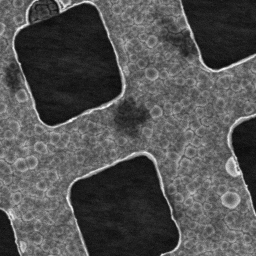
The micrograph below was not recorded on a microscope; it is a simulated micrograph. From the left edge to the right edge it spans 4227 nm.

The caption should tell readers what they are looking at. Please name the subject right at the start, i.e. holes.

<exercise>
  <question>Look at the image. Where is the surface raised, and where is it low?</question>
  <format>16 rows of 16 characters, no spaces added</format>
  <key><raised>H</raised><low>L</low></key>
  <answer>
HHLLLLHHHHHLLLLL
HHLLLLHHHHHHLLLL
HLLLLLLHHHHHLLLL
HLLLLLLHHHHHHLLL
HLLLLLLLHHHHHHHH
HHLLLLLLHHHHHHHH
HHLLLLLHHHHHHHHH
HHHLHHHHHHHHHHHL
HHHHHHHHHHHHHHLL
HHHHHHHHHHHHHHHL
HHHHHHHLLLHHHHHL
HHHHHLLLLLHHHHHL
HHHHLLLLLLHHHHHH
HHHHHLLLLLLHHHHH
LHHHHLLLLLLHHHHH
LHHHHLLLLLLHHHHH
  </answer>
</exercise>